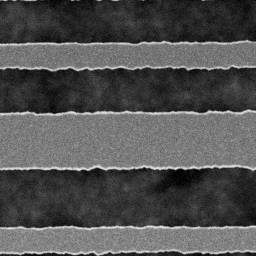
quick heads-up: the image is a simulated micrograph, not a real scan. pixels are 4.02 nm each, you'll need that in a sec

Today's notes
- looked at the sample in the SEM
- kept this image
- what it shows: lines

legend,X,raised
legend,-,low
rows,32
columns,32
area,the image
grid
--------------------------------
--------------------------------
--------------------------------
--------------------------------
--------------------------------
---XXXX-XX-XXXXXXXXXXXXXXXXXXXXX
XXXXXXXXXXXXXXXXXXXXXXXXXXXXXXXX
XXXXXXXXXXXXXXXXXXXXXXXXXXXXXXXX
XXXXXXXXXXXXXXXXXX-X---XXXXXX---
--------------------------------
--------------------------------
--------------------------------
--------------------------------
--------------------------------
XXXXXXXXXXXXXXXXXXXXXXXXXXXXXXXX
XXXXXXXXXXXXXXXXXXXXXXXXXXXXXXXX
XXXXXXXXXXXXXXXXXXXXXXXXXXXXXXXX
XXXXXXXXXXXXXXXXXXXXXXXXXXXXXXXX
XXXXXXXXXXXXXXXXXXXXXXXXXXXXXXXX
XXXXXXXXXXXXXXXXXXXXXXXXXXXXXXXX
XXXXXXXXXXXXXXXXXXXXXXXXXXXXXXXX
--------------------------------
--------------------------------
--------------------------------
--------------------------------
--------------------------------
--------------------------------
--------------------------------
XXXXXXXXXXXXXXXXXXXXXXXXXXXXXXXX
XXXXXXXXXXXXXXXXXXXXXXXXXXXXXXXX
XXXXXXXXXXXXXXXXXXXXXXXXXXXXXXXX
XXXXXXXXXXXXXXXX-X----XXXXXXX---